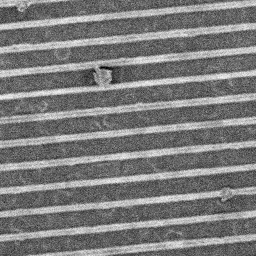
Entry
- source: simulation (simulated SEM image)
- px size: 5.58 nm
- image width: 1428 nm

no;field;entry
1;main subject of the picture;parallel lines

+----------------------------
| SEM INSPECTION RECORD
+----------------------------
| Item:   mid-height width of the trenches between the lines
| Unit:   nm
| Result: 103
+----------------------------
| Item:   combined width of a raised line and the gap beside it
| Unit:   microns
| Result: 0.13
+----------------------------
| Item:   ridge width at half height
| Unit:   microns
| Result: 0.0271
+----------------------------